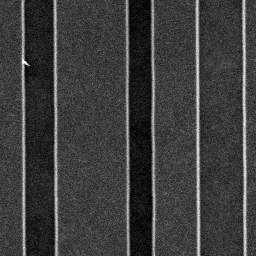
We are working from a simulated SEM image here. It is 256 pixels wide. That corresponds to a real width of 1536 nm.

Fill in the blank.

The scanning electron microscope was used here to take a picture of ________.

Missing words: one or a few lines or trenches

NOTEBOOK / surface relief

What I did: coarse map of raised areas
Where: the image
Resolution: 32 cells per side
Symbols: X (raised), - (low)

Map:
XXX----XXXXXXXXX---XXXXXX------X
XXX----XXXXXXXXX---XXXXXX------X
XXX----XXXXXXXXX---XXXXXX------X
XXX----XXXXXXXXX---XXXXXX------X
XXX----XXXXXXXXX---XXXXXX------X
XXX----XXXXXXXXX---XXXXXX------X
XXX----XXXXXXXXX---XXXXXX------X
XXX----XXXXXXXXX---XXXXXX------X
XXX----XXXXXXXXX---XXXXXX------X
XXX----XXXXXXXXX---XXXXXX------X
XXX----XXXXXXXXX---XXXXXX------X
XXX----XXXXXXXXX---XXXXXX------X
XXX----XXXXXXXXX---XXXXXX-----XX
XXX----XXXXXXXXX---XXXXXX------X
XXX----XXXXXXXXX---XXXXXX------X
XXX----XXXXXXXXX---XXXXXX------X
XXX----XXXXXXXXX---XXXXXX------X
XXX----XXXXXXXXX---XXXXXX------X
XXX----XXXXXXXXX---XXXXXX------X
XXX----XXXXXXXXX---XXXXXX------X
XXX----XXXXXXXXX---XXXXXX------X
XXX----XXXXXXXXX---XXXXXX------X
XXX----XXXXXXXXX---XXXXXX------X
XXX----XXXXXXXXX---XXXXXX------X
XXX----XXXXXXXXX---XXXXXX------X
XXX----XXXXXXXXX---XXXXXX------X
XXX----XXXXXXXXX---XXXXXX------X
XXX----XXXXXXXXX---XXXXXX------X
XXX----XXXXXXXXX---XXXXXX------X
XXX----XXXXXXXXX---XXXXXX------X
XXX----XXXXXXXXX---XXXXXX------X
XXX----XXXXXXXXX---XXXXXX------X